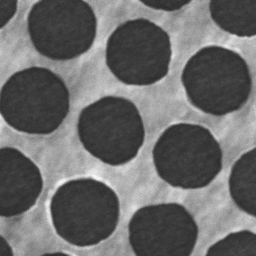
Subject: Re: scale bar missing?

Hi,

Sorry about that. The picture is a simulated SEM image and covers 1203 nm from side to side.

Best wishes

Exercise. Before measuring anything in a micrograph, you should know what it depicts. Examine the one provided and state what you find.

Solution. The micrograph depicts holes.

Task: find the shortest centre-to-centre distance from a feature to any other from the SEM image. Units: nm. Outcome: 381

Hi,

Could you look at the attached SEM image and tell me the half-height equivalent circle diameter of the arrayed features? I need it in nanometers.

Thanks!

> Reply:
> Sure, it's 318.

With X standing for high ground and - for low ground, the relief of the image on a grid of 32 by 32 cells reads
--XX-------XXXXXXX-----XXX------
--XX--------XXXXXXXXXXXXXX------
-XX---------XXXX--XXXXXXXXX-----
XXX---------XXX-----XXXXXXXX----
XXXX--------XX-------XXXXXXXXX--
XXXX-------XX--------XXXXXXXXXXX
XXXXX------XX--------XXXX----XXX
XXXXXXXXXXXXX--------XXX------XX
XXXX-XXXXXXXXX-------XX--------X
X------XXXXXXX-------XX--------X
X-------XXXXXXXX---XXXX--------X
---------XXXXXXXXXXXXXX--------X
---------XXX----XXXXXXXX-------X
---------XX------XXXXXXXX-----XX
--------XX--------XXXXXXXXXXXXXX
X-------XX--------XXXX--XXXXXXXX
XXX---XXXX--------XX------XXXXXX
XXXXXXXXXX--------XX-------XXXXX
--XXXXXXXXX------XX---------XXXX
---XXXXXXXXX-----XX---------XX--
----XXXXXXXXX--XXXX---------X---
-----XXXXXXXXXXXXXXX-------XX---
-----XXXXX--XXXXXXXX-------XX---
-----XX-------XXXXXXXXX--XXXX---
-----XX--------XXXXXXXXXXXXXX---
----XX---------XXXXX--XXXXXXX---
---XXX---------XX------XXXXXXXX-
XXXXXXX--------X--------XXXXXXXX
XXXXXXX--------X---------XXXXXXX
XXXXXXX-------XX---------XXX----
-XXXXXXXX---XXXX--------XXX-----
--XXXXXXXXXXXXXXX-------XX------